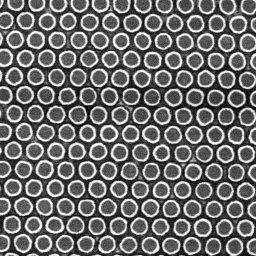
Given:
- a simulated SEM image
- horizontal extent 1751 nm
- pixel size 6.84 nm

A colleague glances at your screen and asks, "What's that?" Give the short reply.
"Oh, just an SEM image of a regular array of raised bodies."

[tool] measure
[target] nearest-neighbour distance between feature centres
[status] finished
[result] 143 nm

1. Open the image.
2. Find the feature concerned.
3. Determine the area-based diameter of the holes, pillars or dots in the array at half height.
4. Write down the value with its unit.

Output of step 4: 110 nm